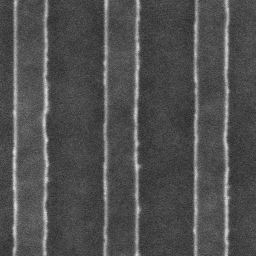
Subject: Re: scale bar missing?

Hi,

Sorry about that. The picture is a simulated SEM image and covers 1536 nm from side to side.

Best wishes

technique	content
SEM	lines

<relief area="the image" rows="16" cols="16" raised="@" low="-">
-@@----@@---@@--
-@@----@@---@@--
-@@----@@---@@--
-@@----@@---@@--
-@@----@@---@@--
-@@----@@---@@--
-@@----@@---@@--
-@@----@@---@@--
-@@----@@---@@--
-@@----@@---@@--
-@@----@@---@@--
-@@----@@---@@--
-@@----@@---@@--
-@@----@@---@@--
-@@----@@---@@--
-@@----@@---@@--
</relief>